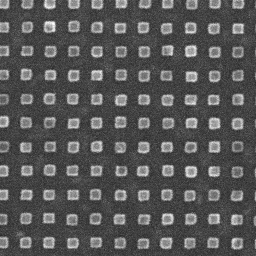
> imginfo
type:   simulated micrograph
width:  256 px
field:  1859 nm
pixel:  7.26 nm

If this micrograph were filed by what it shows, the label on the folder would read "a regular array of raised bodies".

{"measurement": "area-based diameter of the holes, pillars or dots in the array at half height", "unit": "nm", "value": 76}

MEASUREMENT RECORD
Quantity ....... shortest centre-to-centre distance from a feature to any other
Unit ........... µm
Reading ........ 0.167